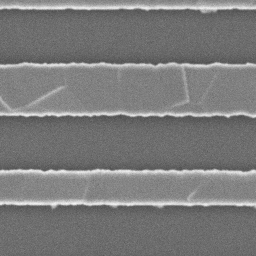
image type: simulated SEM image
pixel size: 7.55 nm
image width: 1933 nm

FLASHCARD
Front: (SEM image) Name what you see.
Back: lines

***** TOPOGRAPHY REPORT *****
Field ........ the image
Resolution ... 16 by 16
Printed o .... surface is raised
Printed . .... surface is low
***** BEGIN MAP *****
oooooooooooooooo
................
................
................
oooooooooooooooo
oooooooooooooooo
oooooooooooooooo
................
................
................
................
oooooooooooooooo
oooooooooooooooo
................
................
................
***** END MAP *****